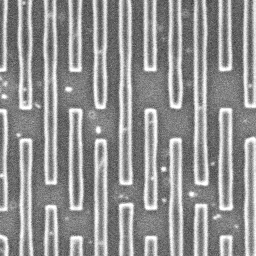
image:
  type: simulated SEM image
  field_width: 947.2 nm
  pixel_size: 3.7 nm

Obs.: wiring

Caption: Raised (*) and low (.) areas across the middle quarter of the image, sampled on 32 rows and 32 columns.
..**....**....**....***....**...
..**....**....**.....**...***...
........**....**..........***...
........**....**..........***...
........**....**..........***...
........**....***.........***...
........**....***.........***...
........**....***..........**...
........**....***..........**...
........**....***..........**...
........**....***..........**...
..**..........***....*..........
..**..........***....**.........
..**..........***....**.........
..**..........***....**.........
..**..........***....**.........
..**....*.....***....**.........
..**..........***....**.........
..**..........***....**.........
..**....**....***....**....**...
..**....**....***....**....**...
..**....**....***....**....**...
..**....**....***....**....**...
..**....**....***....**....**...
..**....**....***....**....**...
..**....**....***....**....**...
..**....**....***....**....**...
..**....**....***....**....**...
..***...**....***....**....**...
..***...**....***....**....**...
..***...**...........**....**...
..***...**..........***....**...